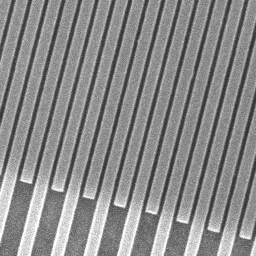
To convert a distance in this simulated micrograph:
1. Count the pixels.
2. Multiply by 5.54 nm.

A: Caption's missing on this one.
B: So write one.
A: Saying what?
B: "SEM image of parallel lines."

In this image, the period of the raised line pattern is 89.4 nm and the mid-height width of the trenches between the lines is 26.8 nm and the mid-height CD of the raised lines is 11.6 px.